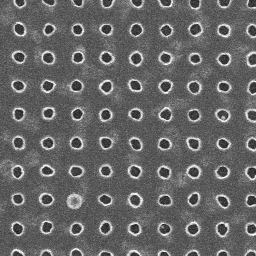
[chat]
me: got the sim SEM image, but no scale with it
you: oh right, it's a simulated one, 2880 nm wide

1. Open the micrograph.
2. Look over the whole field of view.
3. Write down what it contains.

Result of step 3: a regular array of holes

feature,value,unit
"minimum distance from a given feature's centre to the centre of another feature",314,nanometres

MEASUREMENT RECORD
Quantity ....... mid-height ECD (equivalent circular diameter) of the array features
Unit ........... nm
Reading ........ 122